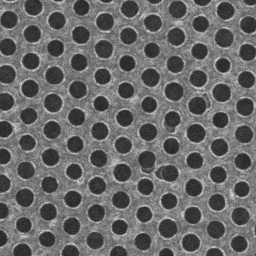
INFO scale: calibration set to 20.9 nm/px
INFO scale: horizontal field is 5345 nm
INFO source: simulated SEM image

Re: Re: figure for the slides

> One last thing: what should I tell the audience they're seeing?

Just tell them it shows a regular array of holes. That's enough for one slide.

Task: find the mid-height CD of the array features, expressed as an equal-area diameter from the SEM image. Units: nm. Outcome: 374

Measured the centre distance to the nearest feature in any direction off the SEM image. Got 568 nanometres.